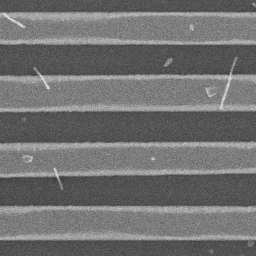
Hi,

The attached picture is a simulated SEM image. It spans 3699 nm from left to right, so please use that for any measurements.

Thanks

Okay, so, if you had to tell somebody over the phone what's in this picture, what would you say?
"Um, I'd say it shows lines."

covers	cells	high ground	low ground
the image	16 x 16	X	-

----------------
XXXXXXXXXXXXXXXX
XXXXXXXXXXXXXXXX
----------------
----------------
XXXXXXXXXXXXXXXX
XXXXXXXXXXXXXXXX
----------------
----------------
XXXXXXXXXXXXXXXX
XXXXXXXXXXXXXXXX
----------------
----------------
XXXXXXXXXXXXXXXX
XXXXXXXXXXXXXXXX
----------------